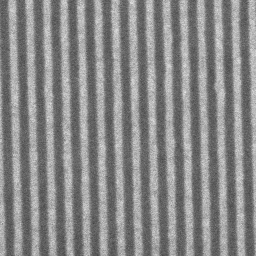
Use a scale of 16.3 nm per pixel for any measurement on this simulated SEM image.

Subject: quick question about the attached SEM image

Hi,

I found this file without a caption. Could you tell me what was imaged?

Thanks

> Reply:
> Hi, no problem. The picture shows parallel lines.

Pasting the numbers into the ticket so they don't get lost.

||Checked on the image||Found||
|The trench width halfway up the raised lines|153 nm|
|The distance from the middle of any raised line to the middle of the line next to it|279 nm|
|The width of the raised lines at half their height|126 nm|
